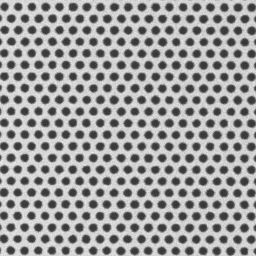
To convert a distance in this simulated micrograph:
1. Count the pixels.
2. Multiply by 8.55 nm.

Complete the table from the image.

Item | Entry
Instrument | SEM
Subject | a regular array of holes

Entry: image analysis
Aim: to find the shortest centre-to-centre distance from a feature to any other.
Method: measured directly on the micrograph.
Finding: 0.113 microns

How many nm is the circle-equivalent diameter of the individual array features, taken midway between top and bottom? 78.9